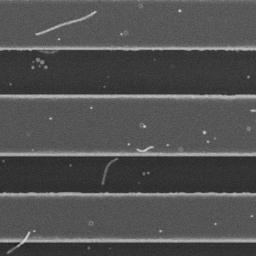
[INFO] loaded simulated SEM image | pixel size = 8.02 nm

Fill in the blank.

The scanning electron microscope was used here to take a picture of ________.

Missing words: lines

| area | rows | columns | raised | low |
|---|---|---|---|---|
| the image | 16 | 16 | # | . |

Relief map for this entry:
################
################
################
................
................
................
################
################
################
################
................
................
################
################
################
................